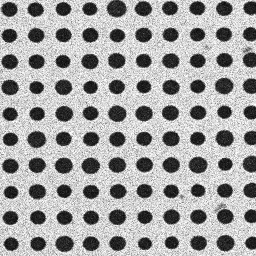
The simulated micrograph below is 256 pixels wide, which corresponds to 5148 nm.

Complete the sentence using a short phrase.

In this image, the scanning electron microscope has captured a regular array of holes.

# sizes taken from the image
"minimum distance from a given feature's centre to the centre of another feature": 520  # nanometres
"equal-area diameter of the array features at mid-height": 312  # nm